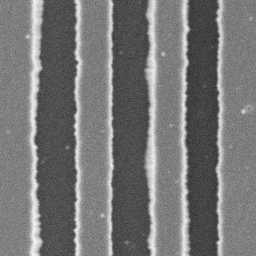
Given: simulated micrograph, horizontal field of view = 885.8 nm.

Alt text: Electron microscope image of lines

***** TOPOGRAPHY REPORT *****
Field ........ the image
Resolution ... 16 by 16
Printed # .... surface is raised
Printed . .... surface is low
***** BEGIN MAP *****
##...##..###..##
##...##..###..##
##...##..###..##
##...##..###..##
##...##..###..##
##...##...##..##
##...##...##..##
##...##..###..##
##...##..###..##
##...##..###..##
##...##..###..##
##...##..###..##
##...##..###..##
##...##..###..##
##...##...##..##
##...##...##..##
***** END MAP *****